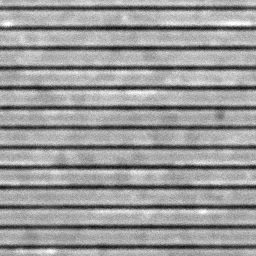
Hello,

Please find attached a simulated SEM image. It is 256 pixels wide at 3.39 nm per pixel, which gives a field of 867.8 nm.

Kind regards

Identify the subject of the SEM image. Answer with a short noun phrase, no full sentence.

parallel lines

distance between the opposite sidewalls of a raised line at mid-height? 14.8 pixels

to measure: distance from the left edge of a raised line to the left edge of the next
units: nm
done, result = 67.6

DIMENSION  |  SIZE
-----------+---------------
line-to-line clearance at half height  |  17.8 nm